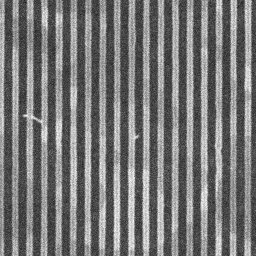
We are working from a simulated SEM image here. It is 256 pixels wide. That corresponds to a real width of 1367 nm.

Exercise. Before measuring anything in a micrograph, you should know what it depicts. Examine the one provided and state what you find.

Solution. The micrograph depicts parallel lines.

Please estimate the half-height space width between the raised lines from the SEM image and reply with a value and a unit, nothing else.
54.7 nanometers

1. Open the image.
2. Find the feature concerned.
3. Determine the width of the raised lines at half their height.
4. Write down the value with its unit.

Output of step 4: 24.7 nm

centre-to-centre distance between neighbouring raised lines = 77.5 nanometres